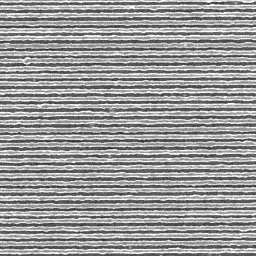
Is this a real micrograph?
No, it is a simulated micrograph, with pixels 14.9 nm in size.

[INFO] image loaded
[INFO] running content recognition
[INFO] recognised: parallel lines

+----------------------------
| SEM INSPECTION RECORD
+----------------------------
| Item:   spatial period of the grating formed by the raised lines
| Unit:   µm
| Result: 0.113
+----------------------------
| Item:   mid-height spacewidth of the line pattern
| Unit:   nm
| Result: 57.7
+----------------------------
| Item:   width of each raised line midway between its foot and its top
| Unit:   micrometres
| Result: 0.0595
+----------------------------